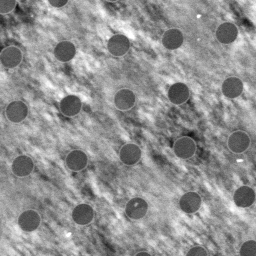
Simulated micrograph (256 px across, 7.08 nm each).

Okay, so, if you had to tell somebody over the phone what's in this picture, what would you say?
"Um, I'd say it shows a regular array of raised bodies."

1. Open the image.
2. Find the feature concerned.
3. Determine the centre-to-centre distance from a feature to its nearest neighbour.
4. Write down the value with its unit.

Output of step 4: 0.384 microns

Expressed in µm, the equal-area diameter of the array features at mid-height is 0.165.